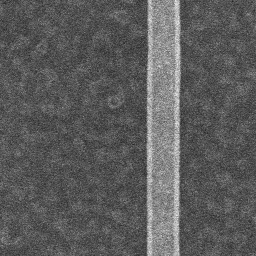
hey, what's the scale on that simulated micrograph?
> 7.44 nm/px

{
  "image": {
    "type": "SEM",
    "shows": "one or a few lines or trenches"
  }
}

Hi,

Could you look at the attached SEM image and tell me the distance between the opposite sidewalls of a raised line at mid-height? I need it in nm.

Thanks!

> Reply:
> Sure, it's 204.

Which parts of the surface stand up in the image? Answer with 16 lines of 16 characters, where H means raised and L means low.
LLLLLLLLLHHLLLLL
LLLLLLLLLHHLLLLL
LLLLLLLLLHHLLLLL
LLLLLLLLLHHLLLLL
LLLLLLLLLHHLLLLL
LLLLLLLLLHHLLLLL
LLLLLLLLLHHLLLLL
LLLLLLLLLHHLLLLL
LLLLLLLLLHHLLLLL
LLLLLLLLLHHLLLLL
LLLLLLLLLHHLLLLL
LLLLLLLLLHHLLLLL
LLLLLLLLLHHLLLLL
LLLLLLLLLHHLLLLL
LLLLLLLLLHHLLLLL
LLLLLLLLLHHLLLLL